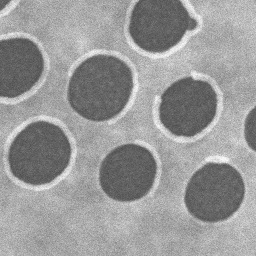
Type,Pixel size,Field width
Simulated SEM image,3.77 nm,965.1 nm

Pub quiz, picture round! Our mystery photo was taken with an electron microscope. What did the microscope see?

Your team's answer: holes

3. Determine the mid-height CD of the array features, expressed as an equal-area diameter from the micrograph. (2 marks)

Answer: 227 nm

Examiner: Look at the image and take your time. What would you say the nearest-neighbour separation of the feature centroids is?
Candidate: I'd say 336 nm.